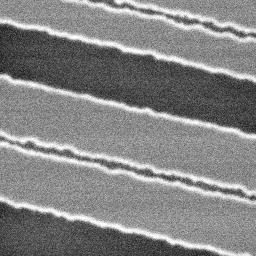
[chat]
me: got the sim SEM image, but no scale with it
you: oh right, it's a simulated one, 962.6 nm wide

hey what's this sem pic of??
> lines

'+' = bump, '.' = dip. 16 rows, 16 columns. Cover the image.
++++++++++++++++
.+++++++++++++++
.....+++++++++++
..........++++++
..............++
+++.............
+++++++.........
++++++++++++....
++++++++++++++++
++++++++++++++++
++++++++++++++++
++++++++++++++++
++++++++++++++++
....++++++++++++
........++++++++
.............+++